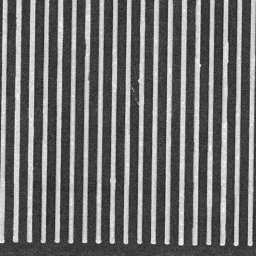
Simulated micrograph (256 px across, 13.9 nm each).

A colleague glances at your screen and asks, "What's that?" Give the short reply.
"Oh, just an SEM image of parallel lines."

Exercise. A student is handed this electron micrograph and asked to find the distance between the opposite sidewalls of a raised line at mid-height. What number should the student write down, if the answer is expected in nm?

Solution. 62.5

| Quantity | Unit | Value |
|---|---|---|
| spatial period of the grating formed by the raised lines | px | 13.8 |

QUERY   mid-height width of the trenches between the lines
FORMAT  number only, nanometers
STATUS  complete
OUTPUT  127